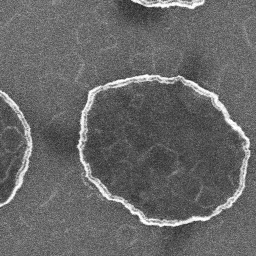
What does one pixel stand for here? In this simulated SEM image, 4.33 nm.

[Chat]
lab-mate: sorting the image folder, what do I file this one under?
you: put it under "raised bodies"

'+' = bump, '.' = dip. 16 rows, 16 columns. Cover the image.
................
................
................
................
................
......+++++++...
+....+++++++++..
++...+++++++++..
++...++++++++++.
++...+++++++++++
++...++++++++++.
+.....+++++++++.
+......++++++++.
.........++++...
................
................